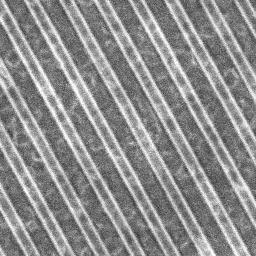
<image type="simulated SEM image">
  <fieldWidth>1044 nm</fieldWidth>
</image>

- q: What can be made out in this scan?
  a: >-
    parallel lines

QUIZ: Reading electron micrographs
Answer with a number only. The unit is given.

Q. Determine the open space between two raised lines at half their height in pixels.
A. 19.6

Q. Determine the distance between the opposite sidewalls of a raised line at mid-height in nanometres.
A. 45.5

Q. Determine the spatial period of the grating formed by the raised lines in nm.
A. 125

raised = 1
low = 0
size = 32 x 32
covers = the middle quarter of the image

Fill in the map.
11100000111000000111000000111000
11100000011100000111100000111000
01110000011100000011100000011100
01110000001110000001110000011100
00111000001111000001110000001110
00111000000111000000111000001110
00011100000111100000111100000111
00011110000011100000011100000011
00001110000001110000011110000011
00001111000001110000001110000001
00000111000000111000001111000001
00000111100000111100000111000000
10000011100000011100000011100000
10000011110000001110000011100000
10000001110000001110000001110000
11000000111000000111000001111000
11000000111100000111000000111000
11100000011100000111100000111100
01110000011110000011100000011100
01110000001110000001110000011100
00111000001111000001111000001110
00111000000111000000111000001111
00011100000111100000111100000111
00001100000011100000011100000011
00001110000001110000011110000011
00001110000001110000001110000001
00000111000000111000001111000001
00000111100000111100000111000000
10000011100000011100000011100000
10000001110000011110000011100000
11000001110000001110000001110000
11000000111000001111000001111000